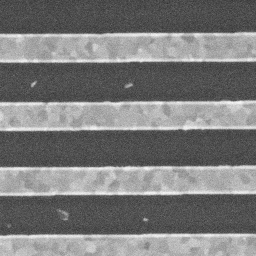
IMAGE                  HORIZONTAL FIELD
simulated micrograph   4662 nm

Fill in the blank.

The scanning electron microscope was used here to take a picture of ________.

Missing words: lines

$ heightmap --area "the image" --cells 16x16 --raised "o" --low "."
................
................
oooooooooooooooo
oooooooooooooooo
................
................
oooooooooooooooo
oooooooooooooooo
................
................
.ooooooooooooooo
oooooooooooooooo
................
................
................
oooooooooooooooo